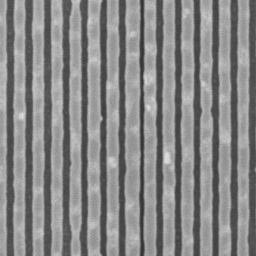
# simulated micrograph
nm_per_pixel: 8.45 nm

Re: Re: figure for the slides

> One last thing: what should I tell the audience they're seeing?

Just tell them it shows parallel lines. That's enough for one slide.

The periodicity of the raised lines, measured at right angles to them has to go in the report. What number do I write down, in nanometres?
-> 158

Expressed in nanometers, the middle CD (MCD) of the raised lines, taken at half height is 100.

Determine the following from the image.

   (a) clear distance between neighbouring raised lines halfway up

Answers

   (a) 57.1 nm